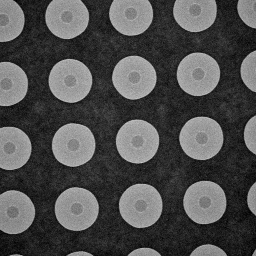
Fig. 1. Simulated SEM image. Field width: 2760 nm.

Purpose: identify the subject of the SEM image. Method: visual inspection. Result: an array of small figures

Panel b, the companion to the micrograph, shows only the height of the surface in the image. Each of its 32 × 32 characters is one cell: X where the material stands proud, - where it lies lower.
XX----XXXX----XXXXX---XXXXX---XX
XXX---XXXXX---XXXXX---XXXXX---XX
XXX---XXXXX---XXXXX---XXXXX---XX
XXX---XXXXX---XXXX-----XXX------
XX-----XXX----------------------
--------------------------------
--------------------------------
--------X------XXX-----XXXX----X
XXX----XXXX---XXXXX---XXXXX---XX
XXX---XXXXX---XXXXX---XXXXX---XX
XXX---XXXXX---XXXXX---XXXXX----X
XXX----XXXX----XXXX----XXX------
XXX-----XX----------------------
--------------------------------
--------------------------------
----------------XXX----XXXX----X
XXX----XXXX----XXXXX---XXXXX---X
XXXX---XXXXX---XXXXX--XXXXXX---X
XXXX---XXXXX---XXXXX---XXXXX---X
XXXX---XXXXX---XXXX-----XXX-----
XXX-----XX----------------------
--------------------------------
--------------------------------
----------------XXX-----XXXX---X
XXX----XXXXX---XXXXX---XXXXX---X
XXXX---XXXXX---XXXXX---XXXXX---X
XXXX---XXXXX---XXXXX---XXXXX----
XXXX---XXXXX----XXXX----XXX-----
XXX-----XXX---------------------
--------------------------------
--------------------------------
----------X------XXX----XXXX----